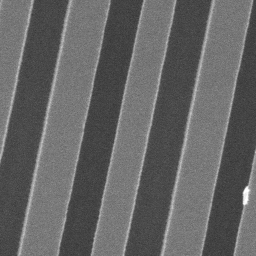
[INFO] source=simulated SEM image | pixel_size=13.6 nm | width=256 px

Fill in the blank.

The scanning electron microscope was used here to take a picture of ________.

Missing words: lines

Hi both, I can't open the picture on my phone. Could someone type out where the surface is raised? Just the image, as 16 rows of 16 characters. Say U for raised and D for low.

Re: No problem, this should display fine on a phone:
UUDDUUUDDUUDDUUU
UUDDUUUDDUUDDUUU
UUDDUUDDDUUDDUUD
UDDDUUDDUUDDDUUD
UDDUUUDDUUDDUUUD
UDDUUUDDUUDDUUUD
UDDUUUDDUUDDUUDD
UDDUUDDUUDDDUUDD
DDDUUDDUUDDDUUDD
DDUUUDDUUDDUUUDD
DDUUUDDUUDDUUUDD
DDUUUDDUUDDUUDDD
DDUUDDUUDDDUUDDU
DDUUDDUUDDDUUDDU
DUUUDDUUDDUUUDDU
DUUUDDUUDDUUUDDU